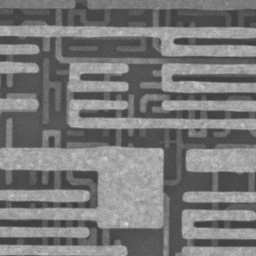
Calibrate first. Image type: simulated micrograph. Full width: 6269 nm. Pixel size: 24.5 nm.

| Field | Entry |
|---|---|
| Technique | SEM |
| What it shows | wiring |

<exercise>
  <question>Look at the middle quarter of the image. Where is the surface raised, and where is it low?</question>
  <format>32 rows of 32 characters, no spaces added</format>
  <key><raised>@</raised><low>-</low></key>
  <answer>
--@@@@@@@@@@@@@@---------@@@@@@@
--@@@@@@@@@@@@@@---------@@@@@@@
--@@---------------------@@@----
--@@---------------------@@-----
--@@@@@@@@---------------@@@-@@@
--@@@@@@@@@@@@@@---------@@@@@@@
--@@@@@@@@@@@@@@---------@@@@@@@
--------------------------------
--------------------------------
--@@@@@@@@@@@@@@---------@@@@@@@
--@@@@@@@@@@@@@@---------@@@@@@@
--@@----------------------------
--@@----------------------------
--@@----------------------------
--@@@@@@@@@@@@@@@@@@@@@@@@@@@@@@
--@@@@@@@@@@@@@@@@@@@@@@@@@@@@@@
--------------------------------
--------------------------------
--------------------------------
--------------------------------
--------------------------------
@@@@@@@@@@@@@@@@@@@@@@@@@------@
@@@@@@@@@@@@@@@@@@@@@@@@@------@
@@@@@@@@@@@@@@@@@@@@@@@@@------@
@@@@@@@@@@@@@@@@@@@@@@@@@------@
@@@@@@@@@@@@@@@@@@@@@@@@@------@
----@@@@@@@@@@@@@@@@@@@@@------@
---------@@@@@@@@@@@@@@@@-------
---------@@@@@@@@@@@@@@@@-------
---------@@@@@@@@@@@@@@@@-------
---------@@@@@@@@@@@@@@@@-------
---------@@@@@@@@@@@@@@@@-------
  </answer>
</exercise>